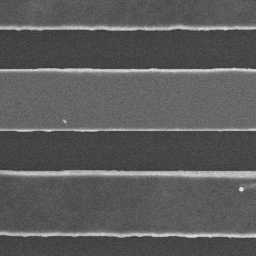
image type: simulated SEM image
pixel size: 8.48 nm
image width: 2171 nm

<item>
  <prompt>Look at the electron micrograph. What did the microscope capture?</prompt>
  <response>lines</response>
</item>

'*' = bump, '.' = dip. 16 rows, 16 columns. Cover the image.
****************
****************
................
................
****************
****************
****************
****************
................
................
................
****************
****************
****************
****************
................